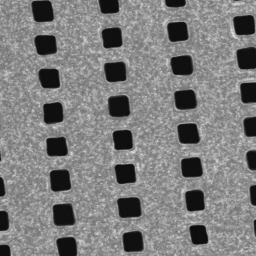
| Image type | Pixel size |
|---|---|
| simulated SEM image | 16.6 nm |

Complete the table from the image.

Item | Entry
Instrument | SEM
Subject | a regular array of holes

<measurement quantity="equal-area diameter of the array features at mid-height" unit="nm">358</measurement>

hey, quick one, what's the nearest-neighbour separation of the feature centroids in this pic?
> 562 nm